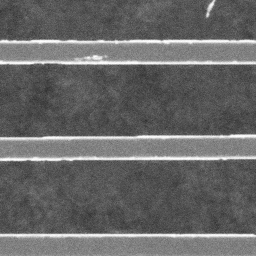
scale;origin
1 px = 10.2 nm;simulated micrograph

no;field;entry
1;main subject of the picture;lines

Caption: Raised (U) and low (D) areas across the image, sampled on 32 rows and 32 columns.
DDDDDDDDDDDDDDDDDDDDDDDDDDDDDDDD
DDDDDDDDDDDDDDDDDDDDDDDDDDDDDDDD
DDDDDDDDDDDDDDDDDDDDDDDDDDDDDDDD
DDDDDDDDDDDDDDDDDDDDDDDDDDDDDDDD
DDDDDDDDDDDDDDDDDDDDDDDDDDDDDDDD
UUUUUUUUUUUUUUUUUUUUUUUUUUUUUUUU
UUUUUUUUUUUUUUUUUUUUUUUUUUUUUUUU
UUUUUUUUUUUUUUUUUUUUUUUUUUUUUUUU
DDDDDDDDDDDDDDDDDDDDDDDDDDDDDDDD
DDDDDDDDDDDDDDDDDDDDDDDDDDDDDDDD
DDDDDDDDDDDDDDDDDDDDDDDDDDDDDDDD
DDDDDDDDDDDDDDDDDDDDDDDDDDDDDDDD
DDDDDDDDDDDDDDDDDDDDDDDDDDDDDDDD
DDDDDDDDDDDDDDDDDDDDDDDDDDDDDDDD
DDDDDDDDDDDDDDDDDDDDDDDDDDDDDDDD
DDDDDDDDDDDDDDDDDDDDDDDDDDDDDDDD
DDDDDDDDDDDDDDDDDDDDDDDDDDDDDDDD
UUUUUUUUUUUUUUUUUUUUUUUUUUUUUUUU
UUUUUUUUUUUUUUUUUUUUUUUUUUUUUUUU
UUUUUUUUUUUUUUUUUUUUUUUUUUUUUUUU
DDDDDDDDDDDDDDDDDDDDDDDDDDDDDDDD
DDDDDDDDDDDDDDDDDDDDDDDDDDDDDDDD
DDDDDDDDDDDDDDDDDDDDDDDDDDDDDDDD
DDDDDDDDDDDDDDDDDDDDDDDDDDDDDDDD
DDDDDDDDDDDDDDDDDDDDDDDDDDDDDDDD
DDDDDDDDDDDDDDDDDDDDDDDDDDDDDDDD
DDDDDDDDDDDDDDDDDDDDDDDDDDDDDDDD
DDDDDDDDDDDDDDDDDDDDDDDDDDDDDDDD
DDDDDDDDDDDDDDDDDDDDDDDDDDDDDDDD
UUUUUUUUUUUUUUUUUUUUUUUUUUUUUUUU
UUUUUUUUUUUUUUUUUUUUUUUUUUUUUUUU
UUUUUUUUUUUUUUUUUUUUUUUUUUUUUUUU